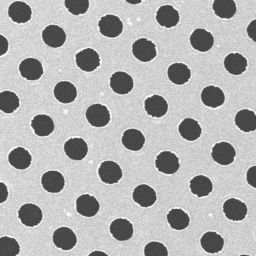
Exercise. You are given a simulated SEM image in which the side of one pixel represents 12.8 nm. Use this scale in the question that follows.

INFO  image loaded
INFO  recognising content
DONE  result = a regular array of holes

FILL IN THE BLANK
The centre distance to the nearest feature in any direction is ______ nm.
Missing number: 511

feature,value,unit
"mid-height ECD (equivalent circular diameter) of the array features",297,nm